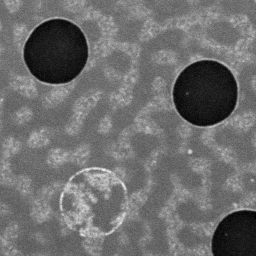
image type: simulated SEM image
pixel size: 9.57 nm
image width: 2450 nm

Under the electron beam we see holes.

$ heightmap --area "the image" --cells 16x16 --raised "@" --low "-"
@@@@@@@@@@@@@@@@
@@@--@@@@@@@@@@@
@@---@@@@@@@@@@@
@----@@@@@@@@@@@
@@---@@@@@@---@@
@@@@@@@@@@@----@
@@@@@@@@@@@----@
@@@@@@@@@@@@--@@
@@@@@@@@@@@@@@@@
@@@@@@@@@@@@@@@@
@@@@@@@@@@@@@@@@
@@@@@@@@@@@@@@@@
@@@@@@@@@@@@@@@@
@@@@@@@@@@@@@@--
@@@@@@@@@@@@@---
@@@@@@@@@@@@@---